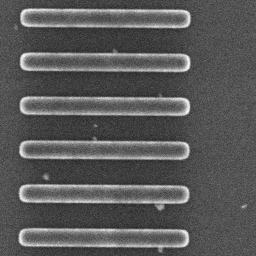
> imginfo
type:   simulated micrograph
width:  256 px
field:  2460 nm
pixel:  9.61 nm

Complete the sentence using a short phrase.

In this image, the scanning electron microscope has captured groups of lines, slits or small figures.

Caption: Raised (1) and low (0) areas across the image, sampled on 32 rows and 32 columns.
00000000000000000000000000000000
00011111111111111111111000000000
00011111111111111111111100000000
00000000000000000000000000000000
00000000000000000000000000000000
00000000000000000000000000000000
00000000000000000000000000000000
00011111111111111111111100000000
00011111111111111111111000000000
00000000000000000000000000000000
00000000000000000000000000000000
00000000000000000000000000000000
00011111111111111111111000000000
00011111111111111111111100000000
00000000000000000000000000000000
00000000000000000000000000000000
00000000000000000000000000000000
00000000000000000000000000000000
00011111111111111111111000000000
00011111111111111111111000000000
00000000000000000000000000000000
00000000000000000000000000000000
00000000000000000000000000000000
00011111111111111111111000000000
00011111111111111111111000000000
00000000000000000000000000000000
00000000000000000000000000000000
00000000000000000000000000000000
00000000000000000000000000000000
00111111111111111111111000000000
00011111111111111111111000000000
00000000000000000000000000000000